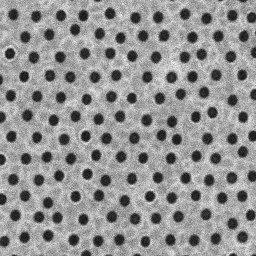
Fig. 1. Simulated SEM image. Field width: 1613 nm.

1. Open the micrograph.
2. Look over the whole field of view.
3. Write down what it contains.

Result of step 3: a regular array of holes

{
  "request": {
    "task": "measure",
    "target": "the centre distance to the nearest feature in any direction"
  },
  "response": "20.5 pixels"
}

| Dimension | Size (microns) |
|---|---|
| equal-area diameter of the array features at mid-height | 0.0704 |